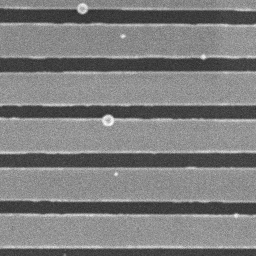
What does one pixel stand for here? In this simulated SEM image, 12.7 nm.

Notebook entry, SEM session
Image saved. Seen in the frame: lines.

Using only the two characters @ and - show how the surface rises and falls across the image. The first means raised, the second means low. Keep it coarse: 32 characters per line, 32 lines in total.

@@@@@@@@@@@@@@@@@@@@@@@@@@@@@@@@
----------@---------------------
--------------------------------
@@@@@@@@@@@@@@@@@@@@@@@@@@@@@@@@
@@@@@@@@@@@@@@@@@@@@@@@@@@@@@@@@
@@@@@@@@@@@@@@@@@@@@@@@@@@@@@@@@
@@@@@@@@@@@@@@@@@@@@@@@@@@@@@@@@
--------------------------------
--------------------------------
@@@@@@@@@@@@@@@@@@@@@@@@@@@@@@@@
@@@@@@@@@@@@@@@@@@@@@@@@@@@@@@@@
@@@@@@@@@@@@@@@@@@@@@@@@@@@@@@@@
@@@@@@@@@@@@@@@@@@@@@@@@@@@@@@@@
--------------------------------
-------------@------------------
@@@@@@@@@@@@@@@@@@@@@@@@@@@@@@@@
@@@@@@@@@@@@@@@@@@@@@@@@@@@@@@@@
@@@@@@@@@@@@@@@@@@@@@@@@@@@@@@@@
@@@@@@@@@@@@@@@@@@@@@@@@@@@@@@@@
--------------------------------
--------------------------------
@@@@@@@@@@@@@@@@@@@@@@@@@@@@@@@@
@@@@@@@@@@@@@@@@@@@@@@@@@@@@@@@@
@@@@@@@@@@@@@@@@@@@@@@@@@@@@@@@@
@@@@@@@@@@@@@@@@@@@@@@@@@@@@@@@@
--------------------------------
--------------------------------
@@@@@@@@@@@@@@@@@@@@@@@@@@@@@@@@
@@@@@@@@@@@@@@@@@@@@@@@@@@@@@@@@
@@@@@@@@@@@@@@@@@@@@@@@@@@@@@@@@
@@@@@@@@@@@@@@@@@@@@@@@@@@@@@@@@
--------------------------------